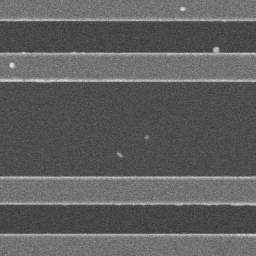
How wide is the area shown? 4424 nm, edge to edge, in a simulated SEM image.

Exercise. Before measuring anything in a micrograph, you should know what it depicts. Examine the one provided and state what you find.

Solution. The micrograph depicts lines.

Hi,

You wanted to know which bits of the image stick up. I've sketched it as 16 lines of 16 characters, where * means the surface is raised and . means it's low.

****************
................
................
****************
****************
................
................
................
................
................
................
****************
****************
................
................
****************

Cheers